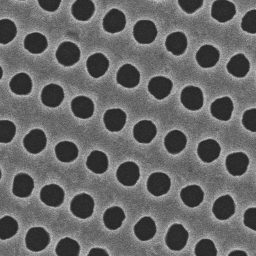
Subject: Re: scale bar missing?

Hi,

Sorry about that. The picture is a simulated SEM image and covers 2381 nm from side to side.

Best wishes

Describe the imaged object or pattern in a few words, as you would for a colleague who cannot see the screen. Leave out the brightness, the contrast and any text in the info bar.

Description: a regular array of holes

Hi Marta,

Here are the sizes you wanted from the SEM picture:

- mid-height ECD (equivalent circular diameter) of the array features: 220 nanometers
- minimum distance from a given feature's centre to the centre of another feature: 302 nm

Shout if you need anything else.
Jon